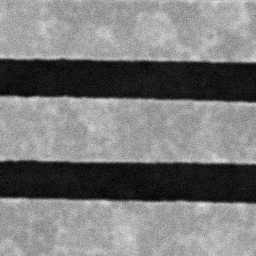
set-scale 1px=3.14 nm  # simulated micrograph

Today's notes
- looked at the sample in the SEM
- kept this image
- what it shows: lines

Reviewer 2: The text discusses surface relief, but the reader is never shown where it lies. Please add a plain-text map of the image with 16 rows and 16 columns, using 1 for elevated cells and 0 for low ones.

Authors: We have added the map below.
1111111111111111
1111111111111111
1111111111111111
1111111111111111
0000000000000000
0000000000000000
1111111111111111
1111111111111111
1111111111111111
1111111111111111
0000000000000000
0000000000000000
1111100000000000
1111111111111111
1111111111111111
1111111111111111